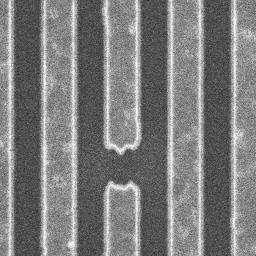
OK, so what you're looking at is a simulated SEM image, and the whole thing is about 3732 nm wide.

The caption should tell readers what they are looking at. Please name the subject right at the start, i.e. parallel lines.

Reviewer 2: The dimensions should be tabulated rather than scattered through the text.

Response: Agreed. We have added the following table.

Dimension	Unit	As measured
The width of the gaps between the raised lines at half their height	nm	452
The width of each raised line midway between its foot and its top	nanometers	465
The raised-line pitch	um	0.924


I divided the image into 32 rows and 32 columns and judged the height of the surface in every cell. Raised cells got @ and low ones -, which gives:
@----@@@@----@@@@----@@@@----@@@
@----@@@@----@@@@----@@@@----@@@
@----@@@@----@@@@----@@@@----@@@
@----@@@@----@@@@----@@@@----@@@
@----@@@@----@@@@----@@@@----@@@
@----@@@@----@@@@----@@@@----@@@
@----@@@@----@@@@----@@@@----@@@
@----@@@@----@@@@----@@@@----@@@
@----@@@@----@@@@----@@@@----@@@
@----@@@@----@@@@----@@@@----@@@
@----@@@@----@@@@----@@@@----@@@
@----@@@@----@@@@----@@@@----@@@
@----@@@@----@@@@----@@@@----@@@
@----@@@@----@@@@----@@@@----@@@
@----@@@@----@@@@----@@@@----@@@
@----@@@@----@@@@----@@@@----@@@
@----@@@@----@@@@----@@@@----@@@
@----@@@@----@@@@----@@@@----@@@
@----@@@@-----@@-----@@@@----@@@
@----@@@@------------@@@@----@@@
@----@@@@------------@@@@----@@@
@----@@@@------------@@@@----@@@
@----@@@@------------@@@@----@@@
@----@@@@----@@@@----@@@@----@@@
@----@@@@----@@@@----@@@@----@@@
@----@@@@----@@@@----@@@@----@@@
@----@@@@----@@@@----@@@@----@@@
@----@@@@----@@@@----@@@@----@@@
@----@@@@----@@@@----@@@@----@@@
@----@@@@----@@@@----@@@@----@@@
@----@@@@----@@@@----@@@@----@@@
@----@@@@----@@@@----@@@@----@@@